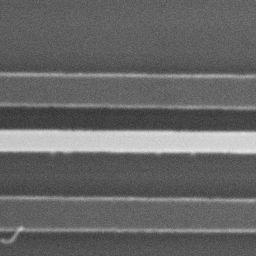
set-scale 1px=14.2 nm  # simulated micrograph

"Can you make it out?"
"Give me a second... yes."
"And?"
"lines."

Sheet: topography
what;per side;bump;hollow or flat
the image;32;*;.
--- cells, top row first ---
................................
................................
................................
................................
................................
................................
................................
................................
................................
****************************....
********************************
********************************
********************************
..............................**
................................
................................
***********************.........
********************************
********************************
................................
................................
................................
................................
................................
................................
********************************
********************************
********************************
********************************
................................
................................
................................